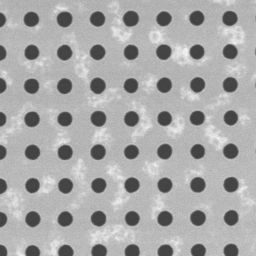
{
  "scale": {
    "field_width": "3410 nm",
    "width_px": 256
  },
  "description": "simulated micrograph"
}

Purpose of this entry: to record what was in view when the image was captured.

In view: a regular array of holes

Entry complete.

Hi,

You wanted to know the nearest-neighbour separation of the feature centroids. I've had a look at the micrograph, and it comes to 437 nanometers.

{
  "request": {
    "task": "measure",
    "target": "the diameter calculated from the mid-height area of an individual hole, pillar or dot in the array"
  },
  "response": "206 nanometres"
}